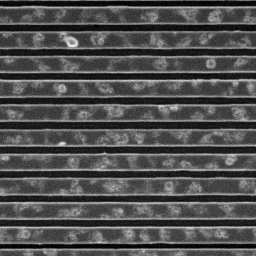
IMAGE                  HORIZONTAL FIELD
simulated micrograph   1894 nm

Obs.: parallel lines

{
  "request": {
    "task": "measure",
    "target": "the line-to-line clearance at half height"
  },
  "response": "56.4 nm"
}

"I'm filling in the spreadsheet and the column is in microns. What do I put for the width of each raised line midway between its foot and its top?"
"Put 0.127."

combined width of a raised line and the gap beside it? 0.181 µm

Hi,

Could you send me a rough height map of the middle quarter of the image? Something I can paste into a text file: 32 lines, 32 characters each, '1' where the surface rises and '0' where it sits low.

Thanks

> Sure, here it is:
11111111111111111111111111111111
11111111111111111111111111111111
00000000000000000000000000000000
00000000000000000000000000000000
11111111111111111111111111111111
11111111111111111111111111111111
11111111111111111111111111111111
11111111111111111111111111111111
00000000000000000000000000000000
00000000000000000000000000000000
11111111111111111111111111111111
11111111111111111111111111111111
11111111111111111111111111111111
11111111111111111111111111111111
00000000000000000000000000000000
00000000000000000000000000000000
00000000000000000001111111111111
11111111111111111111111111111111
11111111111111111111111111111111
11111111111111111111111111111111
11111111111111101111111111111111
00000000000000000000000000000000
00000000011001101100000000000000
11111111111111111111111111111111
11111111111111111111111111111111
11111111111111111111111111111111
00000000000000000000000000000000
00000000000000000000000000000000
00000000000000000000000000011100
11111111111111111111111111111111
11111111111111111111111111111111
11111111111111111111111111111111